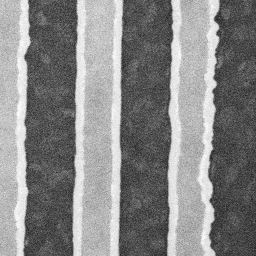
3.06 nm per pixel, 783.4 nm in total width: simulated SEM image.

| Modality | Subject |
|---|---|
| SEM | one or a few lines or trenches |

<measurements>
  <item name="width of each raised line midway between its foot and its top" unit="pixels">38.8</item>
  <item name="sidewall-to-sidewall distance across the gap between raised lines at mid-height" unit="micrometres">0.169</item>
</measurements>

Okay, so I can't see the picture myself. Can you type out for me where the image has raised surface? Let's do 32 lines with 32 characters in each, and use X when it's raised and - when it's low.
XXX-------XXXXX-------XXXXX-----
XXX-------XXXXX-------XXXXX-----
XXX-------XXXXX-------XXXXX-----
XXX-------XXXXX-------XXXXX-----
XXX-------XXXXX-------XXXXX-----
XXX-------XXXXX-------XXXXX-----
XXX-------XXXXX-------XXXXX-----
XXX-------XXXXX-------XXXXX-----
XXX-------XXXXX-------XXXX------
XXX-------XXXXX-------XXXX------
XXX-------XXXXX-------XXXX------
XXX-------XXXXX-------XXXX------
XXX-------XXXXX-------XXXX------
XXX-------XXXXX------XXXXX------
XXX-------XXXXX-------XXXX------
XXX-------XXXXX-------XXXX------
XXX-------XXXXX-------XXXX------
XXX-------XXXXX-------XXXX------
XXX-------XXXXX-------XXXX------
XXX-------XXXXX-------XXXX------
XXX-------XXXXX-------XXXX------
XXX-------XXXXX-------XXXX------
XXX-------XXXXX-------XXXX------
XXX-------XXXXX-------XXXX------
XXX-------XXXXX-------XXXX------
XXX-------XXXXX-------XXXX------
XXX-------XXXXX-------XXXX------
XXX-------XXXXX-------XXXX------
XXX-------XXXX-------XXXXX------
XXX-------XXXX-------XXXXX------
XXX------XXXXX-------XXXXX------
XXX-------XXXX-------XXXXX------